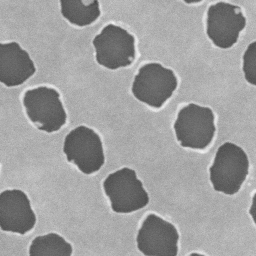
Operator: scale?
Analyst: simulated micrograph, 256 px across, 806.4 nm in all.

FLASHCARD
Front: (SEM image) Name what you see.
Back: holes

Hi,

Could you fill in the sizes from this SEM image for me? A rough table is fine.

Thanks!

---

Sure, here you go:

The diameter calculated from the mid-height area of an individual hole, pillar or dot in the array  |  139 nm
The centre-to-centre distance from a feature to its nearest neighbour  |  54.2 px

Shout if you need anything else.